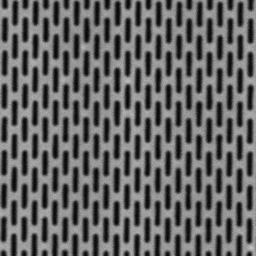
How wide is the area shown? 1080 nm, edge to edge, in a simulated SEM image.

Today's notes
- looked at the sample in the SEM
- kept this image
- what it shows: a regular array of holes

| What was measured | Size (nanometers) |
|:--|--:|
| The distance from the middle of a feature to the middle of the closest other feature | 80.8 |